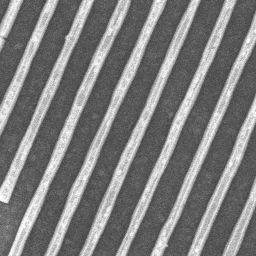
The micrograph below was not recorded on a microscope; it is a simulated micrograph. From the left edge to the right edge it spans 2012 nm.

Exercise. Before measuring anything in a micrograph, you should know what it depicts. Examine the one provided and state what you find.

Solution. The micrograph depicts parallel lines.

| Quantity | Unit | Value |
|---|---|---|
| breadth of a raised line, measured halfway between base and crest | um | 0.0677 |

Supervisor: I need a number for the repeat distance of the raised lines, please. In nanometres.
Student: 258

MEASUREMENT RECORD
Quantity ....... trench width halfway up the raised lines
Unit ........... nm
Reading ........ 190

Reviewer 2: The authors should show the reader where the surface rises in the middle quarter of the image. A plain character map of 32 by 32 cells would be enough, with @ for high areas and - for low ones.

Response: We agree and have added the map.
-------@@-------@@-------@@-----
------@@@------@@@------@@------
------@@-------@@-------@@------
-----@@@------@@@-------@-------
-----@@-------@@-------@@-------
----@@@------@@@-------@@-------
----@@@------@@-------@@-------@
---@@@-------@@-------@@-------@
---@@@------@@@------@@-------@@
---@@-------@@-------@@-------@@
--@@@-------@--------@@------@@@
--@@-------@@-------@@-------@@-
--@@-------@@-------@@------@@@-
-@@-------@@-------@@-------@@--
-@@-------@@-------@@------@@@--
@@@-------@-------@@-------@@---
@@-------@@-------@@-------@@---
@@------@@-------@@@------@@----
@-------@@-------@@-------@@----
@-------@@------@@@-------@@----
@------@@-------@@-------@@-----
-------@@------@@@-------@@-----
------@@-------@@-------@@@-----
------@@------@@@-------@@------
-----@@@------@@@------@@@------
-----@@------@@@-------@@-------
-----@@------@@@-------@@-------
----@@-------@@-------@@-------@
---@@@------@@@-------@@-------@
---@@@------@@-------@@-------@@
--@@@------@@@-------@@-------@@
--@@@------@@@------@@-------@@-